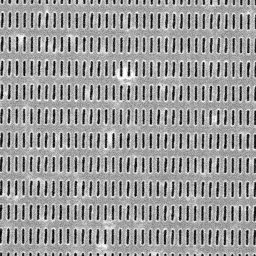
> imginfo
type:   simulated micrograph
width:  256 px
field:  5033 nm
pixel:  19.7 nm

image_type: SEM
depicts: a regular array of holes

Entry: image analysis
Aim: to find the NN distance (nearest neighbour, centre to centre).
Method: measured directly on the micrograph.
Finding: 145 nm